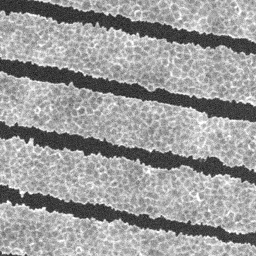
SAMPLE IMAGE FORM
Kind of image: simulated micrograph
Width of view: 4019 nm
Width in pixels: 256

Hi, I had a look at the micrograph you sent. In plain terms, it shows one or a few lines or trenches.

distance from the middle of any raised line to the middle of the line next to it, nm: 988